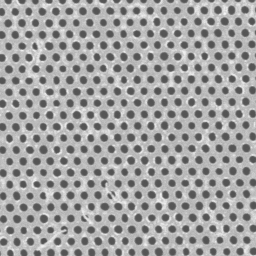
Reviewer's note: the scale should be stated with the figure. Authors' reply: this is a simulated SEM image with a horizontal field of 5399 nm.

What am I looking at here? a regular array of holes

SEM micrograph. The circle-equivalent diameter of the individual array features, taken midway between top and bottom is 173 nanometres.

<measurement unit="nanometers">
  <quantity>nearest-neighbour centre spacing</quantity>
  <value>275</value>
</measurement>